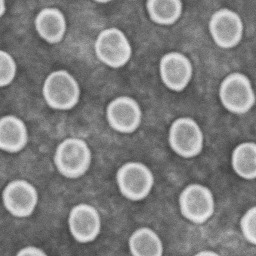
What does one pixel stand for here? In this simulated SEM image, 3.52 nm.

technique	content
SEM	a regular array of raised bodies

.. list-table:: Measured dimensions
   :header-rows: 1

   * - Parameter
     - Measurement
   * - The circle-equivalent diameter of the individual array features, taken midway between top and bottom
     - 115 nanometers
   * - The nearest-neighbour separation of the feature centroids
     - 0.232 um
